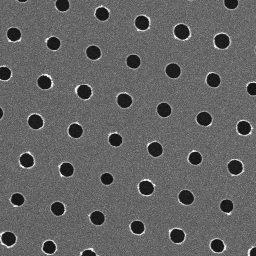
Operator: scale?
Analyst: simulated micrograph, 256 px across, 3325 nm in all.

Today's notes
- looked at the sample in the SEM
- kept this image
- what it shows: a regular array of holes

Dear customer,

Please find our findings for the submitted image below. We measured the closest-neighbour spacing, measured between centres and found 517 nanometers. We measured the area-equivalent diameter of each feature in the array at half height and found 185 nm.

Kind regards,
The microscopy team